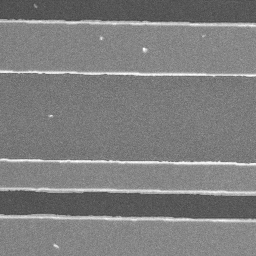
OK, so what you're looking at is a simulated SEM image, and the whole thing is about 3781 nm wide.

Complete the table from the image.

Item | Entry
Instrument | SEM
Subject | lines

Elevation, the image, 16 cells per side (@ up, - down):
----------------
@@@@@@@@@@@@----
@@@@@@@@@@@@@@@@
@@@@@@@@@@@@@@@@
@@@@@@@@@@@@@@@@
----------------
----------------
----------------
----------------
----------------
@@@@@@@@@@@@@@@@
@@@@@@@@@@@@@@@@
----------------
----------------
@@@@@@@@@@@@@@@@
@@@@@@@@@@@@@@@@